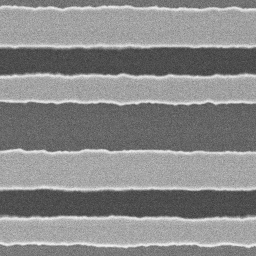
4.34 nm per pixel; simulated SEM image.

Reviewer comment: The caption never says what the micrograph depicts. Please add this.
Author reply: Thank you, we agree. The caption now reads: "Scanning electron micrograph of lines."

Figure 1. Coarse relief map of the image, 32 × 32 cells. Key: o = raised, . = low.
................................
oooooooooooooooooooooooooooooooo
oooooooooooooooooooooooooooooooo
oooooooooooooooooooooooooooooooo
oooooooooooooooooooooooooooooooo
oooooooooooooooooooooooooooooooo
................................
................................
................................
.ooooooo.ooooooo.....o.....o.ooo
oooooooooooooooooooooooooooooooo
oooooooooooooooooooooooooooooooo
oooooooooooooooooooooooooooooooo
................................
................................
................................
................................
................................
................................
oooooooooooooooooooooooooooooooo
oooooooooooooooooooooooooooooooo
oooooooooooooooooooooooooooooooo
oooooooooooooooooooooooooooooooo
ooooo.oooooooooooooooooooooooooo
................................
................................
................................
oooooooooooooooooooooooooooooooo
oooooooooooooooooooooooooooooooo
oooooooooooooooooooooooooooooooo
oooo..oooooooooooooooooooooooooo
................................